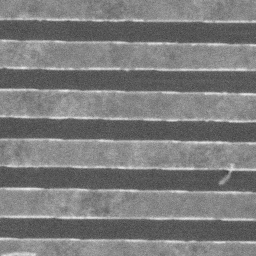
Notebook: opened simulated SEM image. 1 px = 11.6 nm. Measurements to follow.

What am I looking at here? lines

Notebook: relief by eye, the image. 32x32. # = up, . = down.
################################
################################
...........#####################
................................
................................
######################..........
################################
################################
.###############################
................................
................................
###############.................
################################
################################
################################
................................
................................
########........................
################################
################################
################################
................................
................................
................................
################################
################################
################################
................................
................................
................................
################################
################################